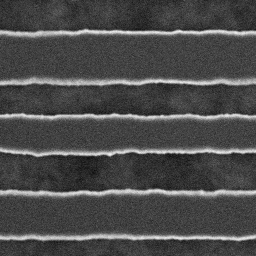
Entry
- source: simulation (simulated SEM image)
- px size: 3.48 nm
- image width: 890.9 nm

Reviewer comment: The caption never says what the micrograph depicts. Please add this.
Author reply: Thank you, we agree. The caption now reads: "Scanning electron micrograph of lines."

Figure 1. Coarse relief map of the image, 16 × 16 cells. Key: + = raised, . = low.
................
................
++++++++++++++++
++++++++++++++++
++++++++++++++++
................
................
++++++++++++++++
++++++++++++++++
++++++++++++++++
................
................
++++++++++++++++
++++++++++++++++
++++++++++++++++
................